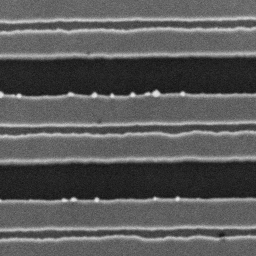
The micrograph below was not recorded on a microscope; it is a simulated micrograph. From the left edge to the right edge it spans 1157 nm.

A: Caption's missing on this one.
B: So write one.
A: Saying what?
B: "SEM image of lines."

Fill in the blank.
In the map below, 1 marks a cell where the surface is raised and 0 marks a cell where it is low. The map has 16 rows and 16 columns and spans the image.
1111111111111111
1111111111111111
1111111111111111
1111011110000000
0000000000000000
0000000000000000
1111111111111111
1111111111111111
1111111111111111
1111111111111111
0000000000000000
0000000000000000
0000111111111111
1111111111111111
1111111111111111
1111111111111111